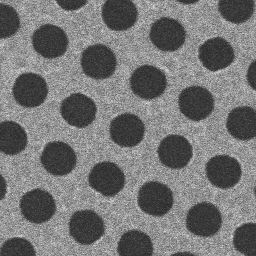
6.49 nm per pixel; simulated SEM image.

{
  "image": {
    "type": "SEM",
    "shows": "a regular array of holes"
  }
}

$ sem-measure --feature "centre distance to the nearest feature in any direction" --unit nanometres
340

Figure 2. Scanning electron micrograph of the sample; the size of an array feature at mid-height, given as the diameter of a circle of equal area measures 232 nanometres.